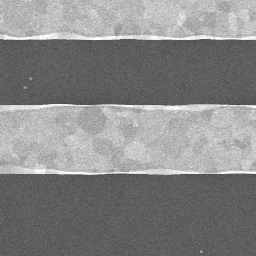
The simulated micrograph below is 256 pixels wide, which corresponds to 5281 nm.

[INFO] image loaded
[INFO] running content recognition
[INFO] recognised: wiring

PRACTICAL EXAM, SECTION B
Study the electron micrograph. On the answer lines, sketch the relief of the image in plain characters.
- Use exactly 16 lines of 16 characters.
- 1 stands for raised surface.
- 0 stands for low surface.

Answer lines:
1111111111111111
1111111111111111
0000000000000000
0000000000000000
0000000000000000
0000000000000000
0000000000000000
1111111111111111
1111111111111111
1111111111111111
1111111111111111
0000000000000000
0000000000000000
0000000000000000
0000000000000000
0000000000000000